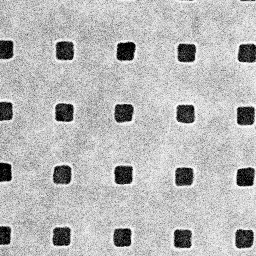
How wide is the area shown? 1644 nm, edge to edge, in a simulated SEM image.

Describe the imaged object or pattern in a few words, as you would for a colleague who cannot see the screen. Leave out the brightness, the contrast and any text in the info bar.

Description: a regular array of holes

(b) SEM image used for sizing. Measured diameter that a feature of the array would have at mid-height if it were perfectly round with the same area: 132 nanometres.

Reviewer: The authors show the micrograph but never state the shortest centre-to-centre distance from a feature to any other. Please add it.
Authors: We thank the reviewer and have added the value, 389 nm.